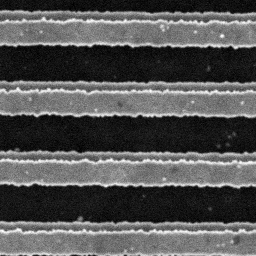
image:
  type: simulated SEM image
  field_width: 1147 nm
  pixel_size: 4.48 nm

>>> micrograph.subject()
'lines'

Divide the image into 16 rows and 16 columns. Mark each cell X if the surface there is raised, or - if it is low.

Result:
----------------
XXXXXXXXXXXXXXXX
XXXXXXXXXXXXXXXX
----------------
----------------
XXXXXXXXXXXXXXXX
XXXXXXXXXXXXXXXX
----------------
----------------
X-X-------------
XXXXXXXXXXXXXXXX
XXXXXXXXXXXXXXXX
----------------
----------------
XXXXXXXXXXXXXXXX
XXXXXXXXXXXXXXXX